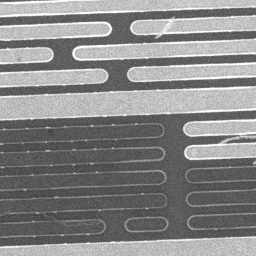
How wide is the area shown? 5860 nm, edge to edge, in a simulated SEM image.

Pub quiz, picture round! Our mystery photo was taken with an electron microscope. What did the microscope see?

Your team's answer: groups of lines, slits or small figures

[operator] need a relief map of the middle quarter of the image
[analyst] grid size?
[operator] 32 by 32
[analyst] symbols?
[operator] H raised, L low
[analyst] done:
LLLLLLLLLLLLLLLLLLLLLLLLLLLLLLLH
LLLLLLLLHHLLLLLLHHHHHHHHHHHHHHHH
HHHHHHHHHHHLLLLLHHHHHHHHHHHHHHHH
HHHHHHHHHHHLLLLLHHHHHHHHHHHHHHHH
HHHHHHHHHHLLLLLLLLLLLLLLLLLLLLLL
LLLLLLLLLLLLLLLLLLLLLLLLLLLLLLLL
LLLLLLLLLLLLLLLLLLLLLLLLLLLHHHHH
LLLLHHHHHHHHHHHHHHHHHHHHHHHHHHHH
HHHHHHHHHHHHHHHHHHHHHHHHHHHHHHHH
HHHHHHHHHHHHHHHHHHHHHHHHHHHHHHHH
HHHHHHHHHHHHHHHHHHHHHHHHHHHHHHHH
HHHHHHHHHHHHHHHHHHHHHHHHHHHHHHHH
HHHHHHHHHHHHHHHHHHHLLLLLLLLLLLLL
LLLLLLLLLLLLLLLLLLLLLLLLLLLLLLLL
LLLLLLLLLLLLLLLLLLLLLLLLLLLLLLLL
LLLLLLLLLLHHHHHHHHHHHHHHHLLLLLHH
HHHHHHHHHHHHHHHHHHHHHHHHHLLLLLHH
HHHHHHHHHHHHHHHHHHHHHHHHHLLLLLLH
HHHHHHHHHHHHHHHHHHHHLLLLLLLLLLLL
LLLLLLLLLLLLLLLLLLLLLLLLLLLLLLLL
LLLLLLLLLLLLLLLLLLLLLLLLLLLLLLLL
LLLLLHHHHHHHHHHHHHHHHHHHHLLLLLHH
HHHHHHHHHHHHHHHHHHHHHHHHHLLLLLHH
HHHHHHHHHHHHHHHHHHHHHHHHHLLLLLLH
HHHHHHHHHHHHHHHLLLLLLLLLLLLLLLLL
LLLLLLLLLLLLLLLLLLLLLLLLLLLLLLLL
LLLLLLLLLLLLLLLLLLLLLLLLLLLLLLLH
HHHHHHHHHHHHHHHHHHHHHHHHHLLLLLHH
HHHHHHHHHHHHHHHHHHHHHHHHHLLLLLHH
HHHHHHHHHHHHHHHHHHHHHHHHHLLLLLLL
HHHHHHHHHHHHLLLLLLLLLLLLLLLLLLLL
LLLLLLLLLLLLLLLLLLLLLLLLLLLLLLLL